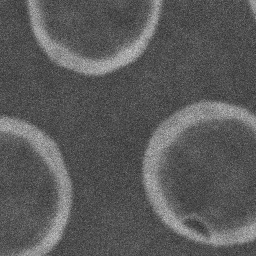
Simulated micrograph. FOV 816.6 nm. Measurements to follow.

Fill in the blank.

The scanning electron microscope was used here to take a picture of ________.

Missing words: raised bodies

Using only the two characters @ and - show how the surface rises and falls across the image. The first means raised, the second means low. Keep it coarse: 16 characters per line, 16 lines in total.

--@@@@@@@@------
--@@@@@@@-------
---@@@@@@-------
----@@@@--------
----------------
----------------
----------------
------------@@@@
@@--------@@@@@@
@@@------@@@@@@@
@@@@-----@@@@@@@
@@@@-----@@@@@@@
@@@@------@@@@@@
@@@@-------@@@@@
@@@@--------@@@@
@@@-------------